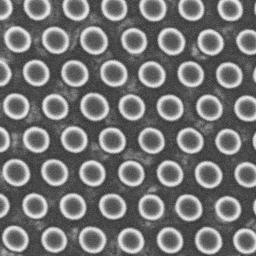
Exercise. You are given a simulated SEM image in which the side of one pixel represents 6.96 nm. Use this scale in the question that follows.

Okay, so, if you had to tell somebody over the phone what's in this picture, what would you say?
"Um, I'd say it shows a regular array of raised bodies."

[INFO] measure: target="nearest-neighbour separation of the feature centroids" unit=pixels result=37.8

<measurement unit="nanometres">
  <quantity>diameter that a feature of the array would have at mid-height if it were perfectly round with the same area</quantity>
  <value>165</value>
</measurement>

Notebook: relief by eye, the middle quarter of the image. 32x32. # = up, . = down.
#####.....#####.....####.....###
#####....######....######....###
######...######....######....###
######....#####....######....###
.####......####.....####......##
......................#.........
................................
................................
.....#####.....###.......###....
.....#####....######....#####...
#...#######...######....######..
#....######...######....#####...
.....#####.....#####....#####...
......####......##.......###....
................................
................................
.###......###........##.......##
#####....#####.....#####.....###
#####....######....######....###
#####....######....######....###
#####....######....######....###
..##......####......####......##
................................
................................
................................
.....####......####.....#####...
#...######....#####.....#####...
#...######....######....#####...
.....#####....######....#####...
.....####......####......####...
................................
................................